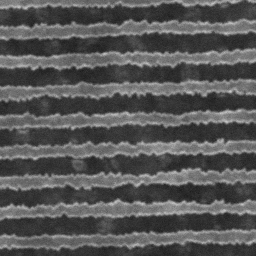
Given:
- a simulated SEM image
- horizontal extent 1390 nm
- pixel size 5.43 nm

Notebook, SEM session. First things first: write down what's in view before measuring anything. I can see parallel lines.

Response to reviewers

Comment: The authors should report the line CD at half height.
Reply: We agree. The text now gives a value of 57 nm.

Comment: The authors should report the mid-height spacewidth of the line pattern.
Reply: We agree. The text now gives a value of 105 nm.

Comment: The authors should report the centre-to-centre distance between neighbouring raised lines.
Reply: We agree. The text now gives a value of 163 nm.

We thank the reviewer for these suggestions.